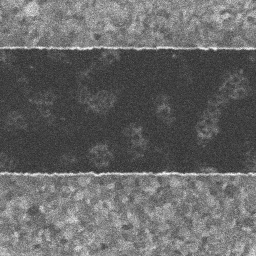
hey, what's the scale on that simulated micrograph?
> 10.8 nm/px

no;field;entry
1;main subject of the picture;one or a few lines or trenches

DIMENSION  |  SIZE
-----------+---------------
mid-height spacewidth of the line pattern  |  1360 nm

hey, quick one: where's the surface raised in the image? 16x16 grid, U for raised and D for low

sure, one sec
UUUUUUUUUUUUUUUU
UUUUUUUUUUUUUUUU
UUUUUUUUUUUUUUUU
DDDDDDDDDDDDDDDD
DDDDDDDDDDDDDDDD
DDDDDDDDDDDDDDDD
DDDDDDDDDDDDDDDD
DDDDDDDDDDDDDDDD
DDDDDDDDDDDDDDDD
DDDDDDDDDDDDDDDD
DDDDDDDDDDDDDDDD
UUUUUUUUUUUUUUUU
UUUUUUUUUUUUUUUU
UUUUUUUUUUUUUUUU
UUUUUUUUUUUUUUUU
UUUUUUUUUUUUUUUU